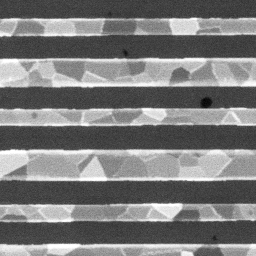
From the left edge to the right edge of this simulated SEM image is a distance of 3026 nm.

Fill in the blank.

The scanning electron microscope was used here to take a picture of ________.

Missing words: lines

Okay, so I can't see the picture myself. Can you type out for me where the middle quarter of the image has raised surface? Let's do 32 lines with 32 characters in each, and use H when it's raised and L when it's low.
HHHHHHHHHHHHHHHHHHHHHHHHHHHHHHHH
HHHHHHHHHHHHHHHHHHHHHHHHHHHHHHHH
HHHHHHHHHHHHHHHHHHHHHHHHHHHHHHHH
HHHHHHHHHHHHHHHHHHHHHHHHHHHHHHHH
HHHHHHHHHHHHHHHHHHHHHHHHHHHHHHHH
LLLLLLLLLLLLLLLLLLLLLLLLLLLLLLLL
LLLLLLLLLLLLLLLLLLLLLLLLLLLLLLLL
LLLLLLLLLLLLLLLLLLLLLLLLLLLLLLLL
LLLLLLLLLLLLLLLLLLLLLLLLLLLLLLLL
LLLLLLLLLLLLLLLLLLLLLLLLLLLLLLLL
LLLLLLLLLLLLLLLLLLLLLLLLLLLLLLLL
LLLLLLLLLLLLLLHHHHHHHHHHHHHHHHHH
HHHHHHHHHHHHHHHHHHHHHHHHHHHHHHHH
HHHHHHHHHHHHHHHHHHHHHHHHHHHHHHHH
HHHHHHHHHHHHHHHHHHHHHHHHHHHHHHHH
LLLLLLLLLLLLLLLLLLLLLLLLLLLLLLLL
LLLLLLLLLLLLLLLLLLLLLLLLLLLLLLLL
LLLLLLLLLLLLLLLLLLLLLLLLLLLLLLLL
LLLLLLLLLLLLLLLLLLLLLLLLLLLLLLLL
LLLLLLLLLLLLLLLLLLLLLLLLLLLLLLLL
LLLLLLLLLLLLLLLLLLLLLLLLLLLLLLLL
LLLLLLLLLLLLLLLLLLLLLLLLLLLLLLLL
HHHHHHHHHHHHHHHHHHHHHHHHHHHHHHHH
HHHHHHHHHHHHHHHHHHHHHHHHHHHHHHHH
HHHHHHHHHHHHHHHHHHHHHHHHHHHHHHHH
HHHHHHHHHHHHHHHHHHHHHHHHHHHHHHHH
HHHHHHHHHHHHHHHHHHHHHHHHHHHHHHHH
HHHHHHHHHHHHHHHHHHHHHHHHHHHHHHHH
HHHHHHHHHHHHHHHHHHHHHHHHHHHHHHHH
LLLLLLLLLLLLLLLLLLLLLLLLLLLLLLLL
LLLLLLLLLLLLLLLLLLLLLLLLLLLLLLLL
LLLLLLLLLLLLLLLLLLLLLLLLLLLLLLLL